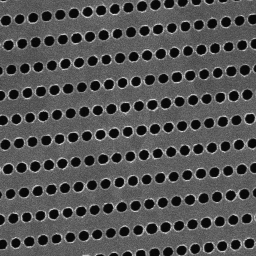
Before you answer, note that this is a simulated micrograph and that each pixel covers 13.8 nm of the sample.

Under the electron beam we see a regular array of holes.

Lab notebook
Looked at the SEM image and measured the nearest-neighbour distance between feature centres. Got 187 nm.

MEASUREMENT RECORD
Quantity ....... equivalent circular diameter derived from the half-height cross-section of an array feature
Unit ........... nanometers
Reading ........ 138